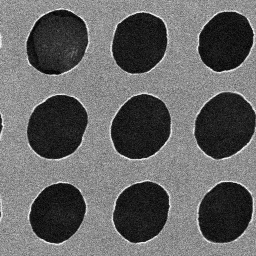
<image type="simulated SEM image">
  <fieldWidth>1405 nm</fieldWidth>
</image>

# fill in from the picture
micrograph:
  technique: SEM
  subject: a regular array of holes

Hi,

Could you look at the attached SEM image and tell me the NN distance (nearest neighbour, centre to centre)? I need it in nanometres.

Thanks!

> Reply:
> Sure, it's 461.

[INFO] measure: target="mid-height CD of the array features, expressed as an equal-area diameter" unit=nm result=321